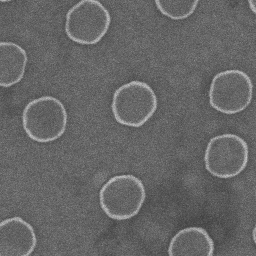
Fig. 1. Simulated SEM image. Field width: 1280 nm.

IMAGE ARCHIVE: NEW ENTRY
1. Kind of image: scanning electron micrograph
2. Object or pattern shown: raised bodies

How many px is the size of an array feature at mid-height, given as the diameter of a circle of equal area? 42.9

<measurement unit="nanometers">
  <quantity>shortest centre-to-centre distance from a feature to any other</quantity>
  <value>454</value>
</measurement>